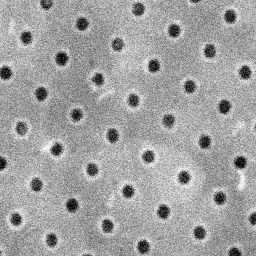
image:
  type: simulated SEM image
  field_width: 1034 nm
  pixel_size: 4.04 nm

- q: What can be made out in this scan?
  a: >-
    a regular array of holes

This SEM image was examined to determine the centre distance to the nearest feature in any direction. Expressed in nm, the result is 163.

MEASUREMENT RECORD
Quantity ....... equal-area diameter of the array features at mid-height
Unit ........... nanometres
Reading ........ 59.7